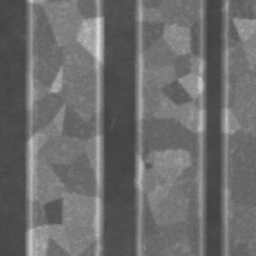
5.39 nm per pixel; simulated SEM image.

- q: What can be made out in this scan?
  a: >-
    one or a few lines or trenches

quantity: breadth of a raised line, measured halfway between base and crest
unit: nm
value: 347